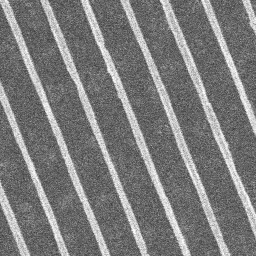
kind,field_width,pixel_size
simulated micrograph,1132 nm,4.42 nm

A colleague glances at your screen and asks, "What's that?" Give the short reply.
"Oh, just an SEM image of parallel lines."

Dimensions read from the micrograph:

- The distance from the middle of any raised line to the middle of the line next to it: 165 nm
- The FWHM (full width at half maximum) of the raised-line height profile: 28.2 nanometers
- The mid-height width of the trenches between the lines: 135 nanometers